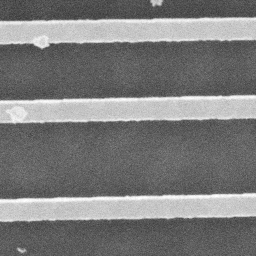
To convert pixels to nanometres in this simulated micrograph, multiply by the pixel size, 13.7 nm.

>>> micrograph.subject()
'lines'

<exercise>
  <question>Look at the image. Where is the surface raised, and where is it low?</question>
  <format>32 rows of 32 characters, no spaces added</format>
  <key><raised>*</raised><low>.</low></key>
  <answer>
................................
................................
.........................*******
********************************
********************************
....**..........................
................................
................................
................................
................................
................................
................................
............********************
********************************
********************************
................................
................................
................................
................................
................................
................................
................................
................................
................................
..........................******
********************************
********************************
*****.*.........................
................................
................................
................................
................................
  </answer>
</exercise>